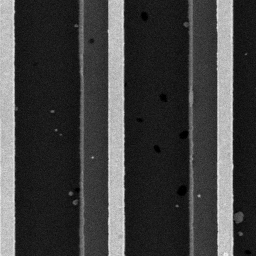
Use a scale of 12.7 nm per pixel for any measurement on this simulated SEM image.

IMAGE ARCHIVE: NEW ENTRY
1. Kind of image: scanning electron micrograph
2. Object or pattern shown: lines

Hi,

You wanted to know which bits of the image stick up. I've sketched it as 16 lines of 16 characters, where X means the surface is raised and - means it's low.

X----XXX----XXX-
X----XXX----XXX-
X----XXX----XXX-
X----XXX----XXX-
X----XXX----XXX-
X----XXX----XXX-
X----XXX----XXX-
X----XXX----XXX-
X----XXX----XXX-
X----XXX----XXX-
X----XXX----XXX-
X----XXX----XXX-
X----XXX----XXX-
X----XXX----XXX-
X----XXX----XXX-
X----XXX----XXX-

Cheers